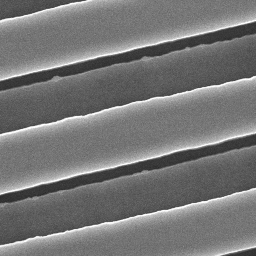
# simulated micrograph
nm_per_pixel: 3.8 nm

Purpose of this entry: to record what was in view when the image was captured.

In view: lines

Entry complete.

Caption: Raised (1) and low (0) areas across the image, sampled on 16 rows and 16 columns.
0001111111111111
1111111111111110
1111111111100000
1111111000000000
1100000000000000
0000000000000111
0000000011111111
0000111111111111
1111111111111110
1111111111100000
1111111000000000
1110000000000000
0000000000000111
0000000001111111
0000111111111111
1111111111111111